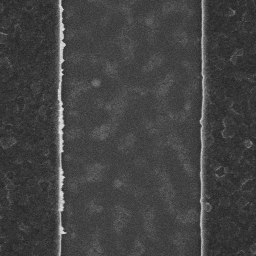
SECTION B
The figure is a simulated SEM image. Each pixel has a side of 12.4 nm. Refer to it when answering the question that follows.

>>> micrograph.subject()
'one or a few lines or trenches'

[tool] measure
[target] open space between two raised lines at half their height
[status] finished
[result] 1740 nm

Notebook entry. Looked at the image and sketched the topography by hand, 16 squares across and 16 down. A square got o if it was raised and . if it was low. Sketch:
oooo.........ooo
oooo.........ooo
oooo.........ooo
oooo.........ooo
oooo.........ooo
oooo.........ooo
oooo.........ooo
oooo.........ooo
oooo.........ooo
oooo.........ooo
oooo.........ooo
oooo.........ooo
oooo.........ooo
oooo.........ooo
oooo.........ooo
oooo.........ooo